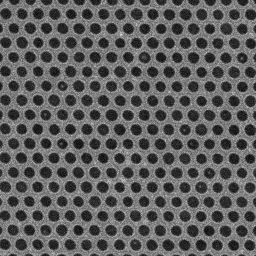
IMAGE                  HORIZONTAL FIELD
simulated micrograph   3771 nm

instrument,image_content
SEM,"a regular array of holes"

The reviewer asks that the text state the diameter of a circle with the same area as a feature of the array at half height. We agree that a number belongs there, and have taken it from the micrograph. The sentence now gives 176 nm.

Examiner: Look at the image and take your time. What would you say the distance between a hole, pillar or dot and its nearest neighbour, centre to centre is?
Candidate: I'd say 0.238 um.